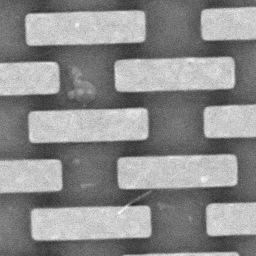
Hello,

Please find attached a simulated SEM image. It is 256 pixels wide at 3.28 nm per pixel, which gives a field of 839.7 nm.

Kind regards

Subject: groups of lines, slits or small figures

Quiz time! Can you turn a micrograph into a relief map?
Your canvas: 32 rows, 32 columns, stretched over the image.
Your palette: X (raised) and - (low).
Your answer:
--------------------------------
-------------XXXXX-------XXXXXXX
---XXXXXXXXXXXXXXX-------XXXXXXX
---XXXXXXXXXXXXXXX-------XXXXXXX
---XXXXXXXXXXXXXXX-------XXXXXXX
----XXX-------------------------
--------------------------------
----------------XXXXXXXXXXXXX---
XXXXXXX-------XXXXXXXXXXXXXXX---
XXXXXXX-------XXXXXXXXXXXXXXX---
XXXXXXX-------XXXXXXXXXXXXXXX---
XXXXXXX-------------------------
--------------------------------
--------------------------XXXXXX
----XXXXXXXXXXXXXX--------XXXXXX
----XXXXXXXXXXXXXX--------XXXXXX
----XXXXXXXXXXXXXX--------XXXXXX
----XXXXXXXXXX------------------
--------------------------------
-----------------------XXXXXX---
XXXXXXXX-------XXXXXXXXXXXXXXX--
XXXXXXXX-------XXXXXXXXXXXXXXX--
XXXXXXXX-------XXXXXXXXXXXXXXX--
XXXXXXXX-------XX---------------
--------------------------------
--------------------------XXXXXX
----XXXXXXXXXXXXXXX-------XXXXXX
----XXXXXXXXXXXXXXX-------XXXXXX
----XXXXXXXXXXXXXXX-------XXXXXX
----XXXXXXXXXXXXXX--------------
--------------------------------
--------------------------------